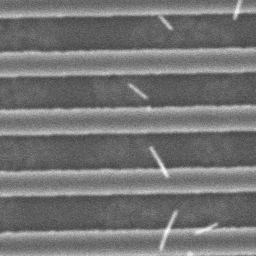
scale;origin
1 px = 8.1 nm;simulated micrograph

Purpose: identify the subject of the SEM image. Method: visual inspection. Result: lines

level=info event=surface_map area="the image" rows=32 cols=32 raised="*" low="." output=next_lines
********************************
*******************************.
................................
................................
................................
................................
..........**********************
********************************
********************************
***.............................
................................
................................
................................
.................**.************
********************************
********************************
*******************.............
................................
................................
................................
................................
********************************
********************************
********************************
................................
................................
................................
................................
................................
********************************
********************************
********************************